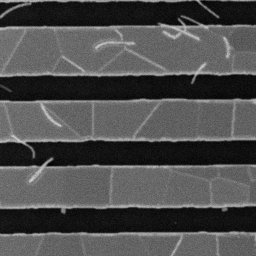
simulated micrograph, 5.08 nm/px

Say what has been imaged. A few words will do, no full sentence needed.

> lines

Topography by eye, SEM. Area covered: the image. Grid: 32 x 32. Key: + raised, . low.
................................
................................
................................
++++++++++++++++++++++++++++++++
++++++++++++++++++++++++++++++++
++++++++++++++++++++++++++++++++
++++++++++++++++++++++++++++++++
++++++++++++++++++++++++++++++++
++++++++++++++++++++++++++++++++
++..........+...................
................................
................................
..................+.++++.....+.+
++++++++++++++++++++++++++++++++
++++++++++++++++++++++++++++++++
++++++++++++++++++++++++++++++++
++++++++++++++++++++++++++++++++
+++++++++++..+++++++++++++++....
................................
................................
................................
++++++++++++++++++++++++++++++++
++++++++++++++++++++++++++++++++
++++++++++++++++++++++++++++++++
++++++++++++++++++++++++++++++++
++++++++++++++++++++++++++++++++
................................
................................
................................
++++++++++++++++++++++++++++++++
++++++++++++++++++++++++++++++++
++++++++++++++++++++++++++++++++